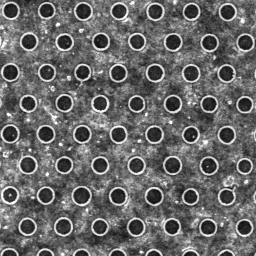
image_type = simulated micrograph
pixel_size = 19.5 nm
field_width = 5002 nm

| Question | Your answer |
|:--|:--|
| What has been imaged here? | a regular array of raised bodies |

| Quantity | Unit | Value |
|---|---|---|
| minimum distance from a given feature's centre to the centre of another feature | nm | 692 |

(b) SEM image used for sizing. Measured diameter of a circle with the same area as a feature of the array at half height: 331 nanometers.